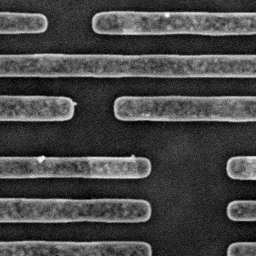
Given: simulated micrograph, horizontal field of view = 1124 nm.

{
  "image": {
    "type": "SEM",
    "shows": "wiring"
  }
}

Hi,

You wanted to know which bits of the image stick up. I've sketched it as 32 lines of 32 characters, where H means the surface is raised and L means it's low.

LLLLLLLLLLLLLLLLLLLLLLLLLLLLLLLL
LLLLLLLLLLLLLLLLLLLLLLLLLLLLLLLL
HHHHHHLLLLLLHHHHHHHHHHHHHHHHHHHH
HHHHHHLLLLLLHHHHHHHHHHHHHHHHHHHH
LLLLLLLLLLLLLLLLLLLLLLLLLLLLLLLL
LLLLLLLLLLLLLLLLLLLLLLLLLLLLLLLL
LLLLLLLLLLLLLLLLLLLLLLLLLLLLLLLL
HHHHHHHHHHHHHHHHHHHHHHHHHHHHHHHH
HHHHHHHHHHHHHHHHHHHHHHHHHHHHHHHH
LLLLLLLLLLLLLLLLLLLLHHHHLLLLLLLL
LLLLLLLLLLLLLLLLLLLLLLLLLLLLLLLL
LLLLLLLLLLLLLLLLLLLLLLLLLLLLLLLL
HHHHHHHHHLLLLLLHHHHHHHHHHHHHHHHH
HHHHHHHHHLLLLLHHHHHHHHHHHHHHHHHH
HHHHHHHHHLLLLLLHHHHHHHHHHHHHHHHH
LLLLLLLLLLLLLLLLLLLLLLLLLLLLLLLL
LLLLLLLLLLLLLLLLLLLLLLLLLLLLLLLL
LLLLLLLLLLLLLLLLLLLLLLLLLLLLLLLL
LLLLLLLLLLLLLLLLLLLLLLLLLLLLLLLL
LLLLLLLLLLLLLLLLLLLLLLLLLLLLLLLL
HHHHHHHHHHHHHHHHHHHLLLLLLLLLHHHH
HHHHHHHHHHHHHHHHHHHLLLLLLLLLHHHH
LLLLLLLLLLLLLLLLLLLLLLLLLLLLLLLL
LLLLLLLLLLLLLLLLLLLLLLLLLLLLLLLL
LLLLLLLLLLLLLLLLLLLLLLLLLLLLLLLL
HHHHHHHHHHHHHHHHHHLLLLLLLLLLLHHH
HHHHHHHHHHHHHHHHHHHLLLLLLLLLHHHH
HHHHHHHHHHHHHHHHHHLLLLLLLLLLLHHH
LLLLLLLLLLLLLLLLLLLLLLLLLLLLLLLL
LLLLLLLLLLLLLLLLLLLLLLLLLLLLLLLL
HHHHHHHHHHHHHHHHHHLLLLLLLLLLLHHH
HHHHHHHHHHHHHHHHHHHLLLLLLLLLLHHH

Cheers